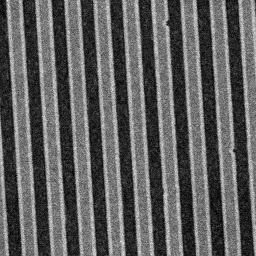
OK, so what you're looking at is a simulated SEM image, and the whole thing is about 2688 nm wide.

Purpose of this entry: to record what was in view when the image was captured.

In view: parallel lines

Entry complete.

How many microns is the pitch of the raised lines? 0.304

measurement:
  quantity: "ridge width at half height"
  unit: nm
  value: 132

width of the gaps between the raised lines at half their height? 177 nm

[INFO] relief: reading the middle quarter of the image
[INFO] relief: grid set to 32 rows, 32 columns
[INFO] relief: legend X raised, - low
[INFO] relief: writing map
--XXX----XXX----XXX----XXX-----X
--XXX----XXX----XXX----XXX-----X
--XXX----XXX----XXX----XXX-----X
--XXX----XXX----XXX-----XX-----X
--XXX----XXX----XXX-----XXX----X
--XXX----XXX----XXX-----XXX----X
--XXX----XXX-----XX-----XXX----X
--XXX----XXX-----XXX----XXX----X
--XXX----XXX-----XXX----XXX----X
--XXX----XXXX----XXX----XXX----X
--XXX----XXXX----XXX----XXX----X
--XXX----XXXX----XXX----XXX----X
--XXX-----XXX----XXX----XXX----X
--XXX-----XXX----XXX----XXX-----
--XXX-----XXX----XXX----XXX-----
---XX-----XXX----XXX----XXX-----
---XXX----XXX----XXX----XXX-----
---XXX----XXX----XXX----XXX-----
---XXX----XXX----XXX----XXX-----
---XXX----XXX----XXX-----XX-----
---XXX----XXX----XXX-----XXX----
---XXX----XXX----XXX-----XXX----
---XXX----XXX-----XX-----XXX----
---XXX----XXX-----XXX----XXX----
---XXX----XXX-----XXX----XXX----
---XXX----XXX-----XXX----XXX----
---XXX----XXX-----XXX----XXX----
---XXX----XXXX----XXX----XXX----
---XXX-----XXX----XXX----XXX----
---XXX-----XXX----XXX----XXX----
---XXX-----XXX----XXX----XXX----
----XX-----XXX----XXX----XXX----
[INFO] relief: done